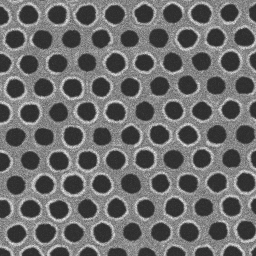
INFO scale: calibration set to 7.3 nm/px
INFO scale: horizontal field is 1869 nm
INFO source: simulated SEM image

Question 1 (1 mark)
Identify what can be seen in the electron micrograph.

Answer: a regular array of holes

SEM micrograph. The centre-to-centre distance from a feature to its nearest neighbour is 0.202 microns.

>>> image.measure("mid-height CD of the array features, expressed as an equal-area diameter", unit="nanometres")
137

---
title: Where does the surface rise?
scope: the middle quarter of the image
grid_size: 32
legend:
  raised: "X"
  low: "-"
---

-XXX----XXX----XXX----XXX-----XX
XXXX---XXXX----XXXX---XXXX---XXX
XXXXXXXXXXXXXXXXXXXXXXXXXXXXXXXX
XXXXXXXXX-XXXXXXXXXXXXX--XXXX---
----XXX----XXXX----XXX----XX----
-----XX-----XX-----XXX----XX----
-----XX----XXX-----XXX----XXX---
----XXXX---XXXX---XXXX---XXXXX--
XXXXXXXXXXXXXXXXXXXXXXXXXXXXXXXX
XXXXX-XXXXXXXXXXXXXX-XXXXX--XXXX
XXXX----XXX----XXX----XXX----XXX
-XX-----XXX----XXX-----XX-----XX
-XX-----XXX----XXX-----XXX----XX
-XXX---XXXX----XXXX---XXXX---XXX
XXXXXXXXXXXXXXXXXXXXXXXXXXXXXXXX
XXXXXXXXXXXXXXXX-XXXXXX-XXXXXX--
----XXXX---XXXX---XXXX----XXX---
-----XX-----XX-----XX-----XXX---
-----XX-----XX-----XXX----XXX---
----XXXX----XXX---XXXX---XXXXX--
XXXXXXXXXXXXXXXXXXXXXXXXXXXXXXXX
XXXXXXXXXXXXXXXXXXX--XXXXXX-XXXX
XXXX----XXX----XXX----XXX-----XX
-XXX----XXX----XXX-----XX-----XX
-XXX----XXX----XXX-----XX-----XX
-XXX----XXX----XXXX---XXXX---XXX
XXXXXXXXXXXXX-XXXXXXXXXXXXXXXXXX
XXXXXXXXXXXXXXXX-XXXXXXX-XXXXXXX
X---XXXX---XXXX----XXX----XXX---
-----XX-----XX-----XXX----XXX---
-----XX-----XX-----XXX----XXX---
-----XXX---XXXX----XXXX---XXXX--